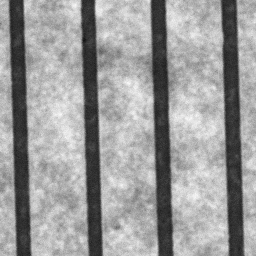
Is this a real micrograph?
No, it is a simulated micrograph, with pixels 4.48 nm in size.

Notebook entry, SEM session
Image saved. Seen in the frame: one or a few lines or trenches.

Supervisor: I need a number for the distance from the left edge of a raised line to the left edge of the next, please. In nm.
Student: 316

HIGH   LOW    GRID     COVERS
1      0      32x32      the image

10011111110011111110011111110011
10011111110011111110011111110011
10011111110011111110011111110011
10011111110011111110011111110011
10011111110011111110011111110011
10011111110011111110011111110011
10011111110011111110011111110011
10011111110011111110011111110011
10011111110011111110011111110011
10011111110011111110011111110011
10011111110011111110011111110011
10011111110011111110011111110011
10011111110011111110011111110011
10011111110011111110011111110011
10011111110011111110011111110011
11011111110001111110011111110011
11001111110001111110011111110011
11001111111001111110011111110011
11001111111001111110011111110011
11001111111001111110011111110011
11001111111001111110011111110011
11001111111001111110001111110011
11001111111001111110011111110011
11001111111001111110011111110011
11001111111001111110011111110011
11001111111001111110001111110011
11001111111001111110001111110011
11001111111001111111001111110001
11001111111001111111001111110001
11001111111001111111001111110001
11001111111001111111001111110001
11001111111001111111001111110001